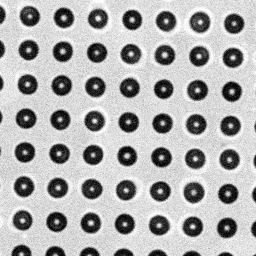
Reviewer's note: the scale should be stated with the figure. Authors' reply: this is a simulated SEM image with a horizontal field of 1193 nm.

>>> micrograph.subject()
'an array of small figures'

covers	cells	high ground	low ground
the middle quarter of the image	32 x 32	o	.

ooooooooooooooooooooooooo.oooooo
oooooooooooooooooooooooooooooooo
oooooooooooooooooooooooooooooooo
.ooooo...oooooo...oooooooooooooo
..ooo.....oooo.....oooo....oooo.
..ooo.....oooo.....oooo....oooo.
..ooo.....oooo.....ooo.....ooo..
.ooooo....oooo....ooooo....ooo..
ooooooo..ooooooo.oooooo...ooooo.
oooooooooooooooooooooooooooooooo
oooooooooooooooooooooooooooooooo
ooooooo..ooooooooooooooooooooooo
.oooo.....ooooo...oooooo..oooooo
..ooo......ooo.....ooo.....oooo.
..ooo......oo......ooo.....ooo..
.oooo.....oooo.....ooo.....ooo..
oooooo....oooo....ooooo....oooo.
oooooooooooooooooooooooo.oooooo.
oooooooooooooooooooooooooooooooo
oooooooooooooooooooooooooooooooo
.ooooo...oooooo.oooooooooooooooo
..ooo.....oooo....oooo....ooooo.
..ooo.....ooo.....oooo.....ooo..
.oooo.....ooo.....oooo.....ooo..
.oooo....ooooo....oooo.....ooo..
ooooooooooooooo..oooooo...ooooo.
oooooooooooooooooooooooooooooooo
oooooooooooooooooooooooooooooooo
oooooo.ooooooooooooooooooooooooo
.ooo.....ooooo....ooooo..oooooo.
.ooo......ooo......ooo....oooo..
.ooo......ooo......oo......oo...